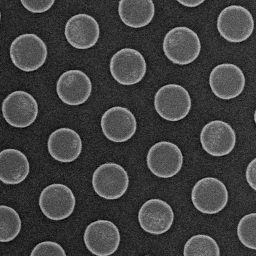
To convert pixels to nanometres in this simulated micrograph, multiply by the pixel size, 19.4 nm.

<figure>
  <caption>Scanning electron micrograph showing a regular array of raised bodies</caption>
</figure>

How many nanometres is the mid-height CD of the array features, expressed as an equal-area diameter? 686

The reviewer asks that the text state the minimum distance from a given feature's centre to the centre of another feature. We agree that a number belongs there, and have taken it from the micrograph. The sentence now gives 1110 nanometers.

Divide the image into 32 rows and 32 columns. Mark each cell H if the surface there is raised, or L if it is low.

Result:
LLLHHHHLLLLLLLLHHHHLLLLHHLLLLLLL
LLLLHLLLLLLLLLLHHHHLLLLLLLLLHHHL
LLLLLLLLLHHHLLLHHHHLLLLLLLLHHHHH
LLLLLLLLHHHHLLLLLLLLLLHLLLLHHHHH
LLLHLLLLHHHHLLLLLLLLLHHHHLLLHHHL
LLHHHLLLLHHHLLLLLLLLLHHHHLLLLLLL
LHHHHHLLLLLLLLLHHLLLLHHHHLLLLLLL
LLHHHHLLLLLLLLHHHHLLLHHHLLLLLLLL
LLHHHLLLLLLLLLHHHHLLLLLLLLLHHHLL
LLLLLLLLHHHLLLHHHHLLLLLLLLHHHHLL
LLLLLLLHHHHLLLLHHLLLLLLLLLHHHHLL
LLHLLLLHHHHLLLLLLLLLHHHLLLLHHHLL
LHHHLLLLHHHLLLLLLLLHHHHHLLLLLLLL
HHHHHLLLLLLLLLHLLLLHHHHHLLLLLLLL
HHHHLLLLLLLLLHHHHLLLHHHLLLLLLLLL
LHHHLLLLLLLLLHHHHLLLLLLLLLHHLLLL
LLLLLLLHHLLLLHHHHLLLLLLLLHHHHLLL
LLLLLLHHHHLLLLHHLLLLLLLLLHHHHLLL
LLLLLLHHHHLLLLLLLLLHHHLLLLHHHLLL
HHHLLLLHHHLLLLLLLLHHHHHLLLLLLLLL
HHHHLLLLLLLLLLLLLLLHHHHLLLLLLLLH
HHHLLLLLLLLLHHHHLLLHHHLLLLLLLLLH
HHHLLLLLLLLLHHHHLLLLLLLLLHHLLLLH
LLLLLLHHLLLLHHHHLLLLLLLLHHHHLLLL
LLLLLHHHHLLLLHHLLLLLLLLLHHHHLLLL
LLLLLHHHHLLLLLLLLLHHHLLLHHHHLLLL
HHLLLHHHHLLLLLLLLHHHHHLLLHHLLLLL
HHLLLLLLLLLLLLLLLHHHHHLLLLLLLLHH
HHLLLLLLLLLHHHHLLLHHHLLLLLLLLLHH
HHLLLLLLLLLHHHHLLLLLLLLLHHLLLLHH
LLLLLHHLLLLHHHHLLLLLLLLHHHHLLLHH
LLLLHHHHLLLLHHLLLLLLLLLHHHHLLLLL